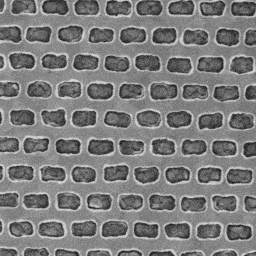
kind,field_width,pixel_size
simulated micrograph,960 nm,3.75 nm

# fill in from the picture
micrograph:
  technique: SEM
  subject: a regular array of holes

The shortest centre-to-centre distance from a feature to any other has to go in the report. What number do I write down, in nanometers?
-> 114